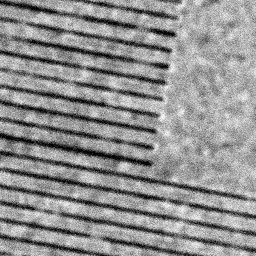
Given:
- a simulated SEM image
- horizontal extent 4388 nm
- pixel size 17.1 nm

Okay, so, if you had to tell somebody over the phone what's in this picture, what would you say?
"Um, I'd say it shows parallel lines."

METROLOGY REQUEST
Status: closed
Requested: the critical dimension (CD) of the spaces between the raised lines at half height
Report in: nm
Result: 105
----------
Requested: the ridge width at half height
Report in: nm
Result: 181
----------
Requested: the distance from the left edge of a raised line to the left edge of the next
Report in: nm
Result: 282